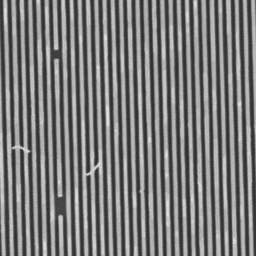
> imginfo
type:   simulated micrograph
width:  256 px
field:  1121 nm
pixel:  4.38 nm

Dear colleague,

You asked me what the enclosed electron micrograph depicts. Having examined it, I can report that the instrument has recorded parallel lines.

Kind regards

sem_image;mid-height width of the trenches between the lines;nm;17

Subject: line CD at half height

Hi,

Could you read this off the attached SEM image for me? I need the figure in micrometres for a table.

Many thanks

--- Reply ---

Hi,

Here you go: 0.017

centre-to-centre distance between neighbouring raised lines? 0.0362 um